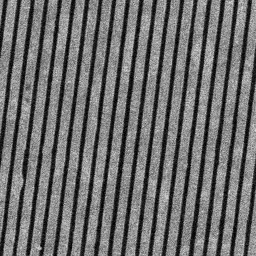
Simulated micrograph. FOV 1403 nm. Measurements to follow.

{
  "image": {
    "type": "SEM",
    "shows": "parallel lines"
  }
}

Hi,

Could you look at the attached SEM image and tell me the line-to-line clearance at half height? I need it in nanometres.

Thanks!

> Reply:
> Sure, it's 28.5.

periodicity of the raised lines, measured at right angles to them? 73.8 nanometers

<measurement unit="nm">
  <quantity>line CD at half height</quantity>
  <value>46.8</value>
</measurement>